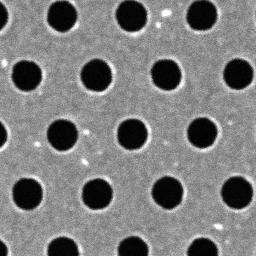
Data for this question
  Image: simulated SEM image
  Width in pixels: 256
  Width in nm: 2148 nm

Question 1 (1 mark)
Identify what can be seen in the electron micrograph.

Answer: a regular array of holes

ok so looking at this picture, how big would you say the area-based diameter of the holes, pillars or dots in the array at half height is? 271 nm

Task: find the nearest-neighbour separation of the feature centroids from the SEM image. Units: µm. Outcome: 0.573